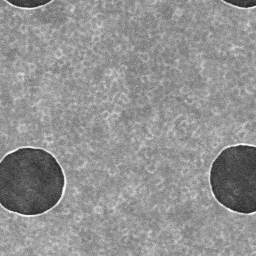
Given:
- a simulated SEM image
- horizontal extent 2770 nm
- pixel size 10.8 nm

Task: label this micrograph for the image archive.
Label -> holes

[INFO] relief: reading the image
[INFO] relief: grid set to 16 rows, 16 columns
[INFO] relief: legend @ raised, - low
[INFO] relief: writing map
@@@@@@@@@@@@@@@@
@@@@@@@@@@@@@@@@
@@@@@@@@@@@@@@@@
@@@@@@@@@@@@@@@@
@@@@@@@@@@@@@@@@
@@@@@@@@@@@@@@@@
@@@@@@@@@@@@@@@@
@@@@@@@@@@@@@@@@
@@@@@@@@@@@@@@@@
@--@@@@@@@@@@@--
----@@@@@@@@@---
----@@@@@@@@@---
----@@@@@@@@@@--
@@@@@@@@@@@@@@@@
@@@@@@@@@@@@@@@@
@@@@@@@@@@@@@@@@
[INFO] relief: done